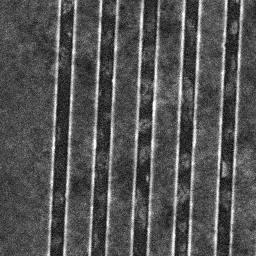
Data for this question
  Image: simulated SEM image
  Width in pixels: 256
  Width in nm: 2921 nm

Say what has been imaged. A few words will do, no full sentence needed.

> parallel lines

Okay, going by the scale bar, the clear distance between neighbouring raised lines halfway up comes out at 170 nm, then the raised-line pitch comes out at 474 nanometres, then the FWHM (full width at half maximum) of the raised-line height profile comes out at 0.307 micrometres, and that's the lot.